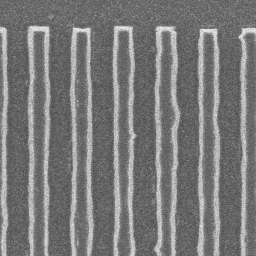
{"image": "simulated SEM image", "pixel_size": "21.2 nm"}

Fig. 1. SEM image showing parallel lines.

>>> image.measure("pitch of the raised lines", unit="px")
42.4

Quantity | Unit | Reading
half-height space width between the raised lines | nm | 554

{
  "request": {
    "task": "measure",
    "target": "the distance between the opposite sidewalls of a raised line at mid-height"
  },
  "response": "350 nanometers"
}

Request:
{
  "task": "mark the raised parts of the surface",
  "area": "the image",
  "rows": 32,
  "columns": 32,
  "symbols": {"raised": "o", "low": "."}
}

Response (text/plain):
................................
................................
................................
...............o................
o...oo...oo...oo....oo...oo...oo
o...oo...oo...oo....oo...oo...oo
o...oo...oo...oo....oo...oo....o
o...oo...oo...ooo...oo...oo...oo
o...oo...oo...ooo...oo...oo...oo
o...oo...oo...ooo...oo...oo...oo
o...oo...oo...ooo...oo...oo...oo
o...oo...oo....oo...oo...oo...oo
o...oo...oo...oo....oo...oo...oo
o...oo...oo...oo....oo...oo...oo
o...oo...oo...oo....oo...oo...oo
o...oo...oo...oo....oo...oo...oo
o...oo...oo...ooo...oo...oo...oo
o...oo...oo...ooo...oo...oo...oo
o...oo...oo...ooo...oo...oo....o
o...oo...oo...ooo...oo...oo....o
o...oo...oo...ooo...oo...oo...oo
o...oo...oo....o....oo...oo...oo
o...oo...oo....o....oo...oo...oo
o...oo...oo....o....oo...oo...oo
o...oo...oo....o....oo...oo...oo
o...oo...oo....o....oo...oo...oo
o...oo...oo....o....oo...oo...oo
o...oo...oo....o....oo...oo...oo
o...oo...oo....o....oo...oo...oo
o...oo...oo...ooo...oo...oo...oo
o...oo...oo...ooo...oo...oo...oo
o...oo...oo...ooo...oo...oo...oo